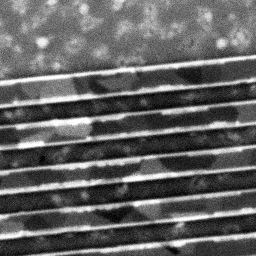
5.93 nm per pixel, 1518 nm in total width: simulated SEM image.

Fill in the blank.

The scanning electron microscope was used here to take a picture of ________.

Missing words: parallel lines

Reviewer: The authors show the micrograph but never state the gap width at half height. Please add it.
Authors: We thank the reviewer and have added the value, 134 nanometres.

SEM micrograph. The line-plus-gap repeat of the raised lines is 260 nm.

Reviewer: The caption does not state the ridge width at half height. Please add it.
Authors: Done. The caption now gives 134 nm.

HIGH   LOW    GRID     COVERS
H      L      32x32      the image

LLLLLLLLLLLLLLLLLLLLLLLLLLLLLLLL
LLLLLLLLLLLLLLLLLLLLLLLLLLLLLLLL
LLLLLLLLLLLLLLLLLLLLLLLLLLLLLLLL
LLLLLLLLLLLLLLLLLLLLLLLLLLLLLLLL
LLLLLLLLLLLLLLLLLLLLLLLLLLLLLLLL
LLLLLLLLLLLLLLLLLLLLLLLLLLLLLLLL
LLLLLLLLLLLLLLLLLLLLLLLLLLLLLLLL
LLLLLLLLLLLLLLLLLLLLLLLLLLLLHHHH
LLLLLLLLLLLLLLLLLLHHHHHHHHHHHHHH
LLLLLLLLHHHHHHHHHHHHHHHHHHHHHHHH
HHHHHHHHHHHHHHHHHHHHHHHHHHHLLLLL
HHHHHHHHHHHHHHHHHHLLLLLLLLLLLLLL
HHHHHHHHLLLLLLLLLLLLLLLLLLLLLLLL
LLLLLLLLLLLLLLLLLLLLLLLLHHHHHHHH
LLLLLLLLLLLLLLHHHHHHHHHHHHHHHHHH
LLLLHHHHHHHHHHHHHHHHHHHHHHHHHHHL
HHHHHHHHHHHHHHHHHHHHHHLLLLLLLLLL
HHHHHHHHHHHHLLLLLLLLLLLLLLLLLLLL
HLLLLLLLLLLLLLLLLLLLLLLLLLLLLLHH
LLLLLLLLLLLLLLLLLLLLHHHHHHHHHHHH
LLLLLLLLLLLHHHHHHHHHHHHHHHHHHHHH
LHHHHHHHHHHHHHHHHHHHHHHHHHLLLLLL
HHHHHHHHHHHHHHHHLLLLLLLLLLLLLLLL
HHHHHHLLLLLLLLLLLLLLLLLLLLLLLLLL
LLLLLLLLLLLLLLLLLLLLLLLLLHHHHHHH
LLLLLLLLLLLLLLLHHHHHHHHHHHHHHHHH
LLLLLHHHHHHHHHHHHHHHHHHHHHHHHHHL
HHHHHHHHHHHHHHHHHHHHHHHLLLLLLLLL
HHHHHHHHHHHHLLLLLLLLLLLLLLLLLLLL
HHLLLLLLLLLLLLLLLLLLLLLLLLLLLLHH
LLLLLLLLLLLLLLLLLLLLHHHHHHHHHHHH
LLLLLLLLLLHHHHHHHHHHHHHHHHHHHHHH